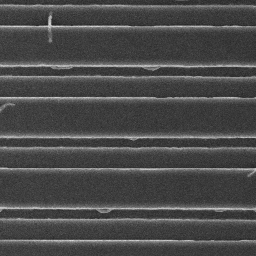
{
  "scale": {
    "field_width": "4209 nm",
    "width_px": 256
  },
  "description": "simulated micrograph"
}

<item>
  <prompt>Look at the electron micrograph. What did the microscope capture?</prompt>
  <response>lines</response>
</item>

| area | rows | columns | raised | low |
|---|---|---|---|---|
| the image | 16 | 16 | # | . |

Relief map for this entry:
................
................
################
################
................
................
################
################
################
................
................
################
################
................
................
################